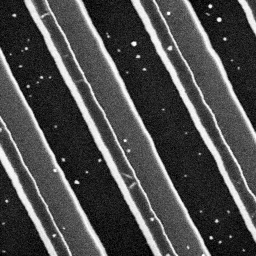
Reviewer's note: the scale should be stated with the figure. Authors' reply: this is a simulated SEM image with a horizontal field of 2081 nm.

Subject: lines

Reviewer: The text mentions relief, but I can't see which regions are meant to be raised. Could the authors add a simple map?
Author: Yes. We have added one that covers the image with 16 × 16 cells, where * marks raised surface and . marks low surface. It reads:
..***....***...*
...***...***....
...***....***...
....***...***...
*...***....***..
*....***...***..
**...***....***.
**....***...***.
***...***....***
***....***...***
.***...***....**
.***....***...**
..***...***....*
..***....***...*
...***...***....
...***....***...